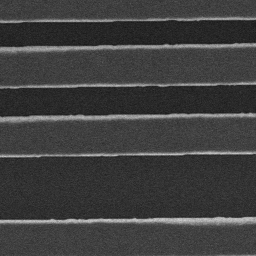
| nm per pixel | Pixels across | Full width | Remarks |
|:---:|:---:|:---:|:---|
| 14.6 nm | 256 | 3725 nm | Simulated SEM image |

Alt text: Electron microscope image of lines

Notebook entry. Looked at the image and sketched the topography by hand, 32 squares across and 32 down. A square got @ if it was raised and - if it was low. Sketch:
@@@@@@@@@@@@@@@@@@@@@@@@@@@@@@@@
@@@@@@@@@@@@@@@@@@@@@@@@@@@@@@@@
@@@@@@@@@@@@@@@@@@@@@-@@@-------
--------------------------------
--------------------------------
--------------------------------
@@@@@@@@@@@@@@@@@@@@@@@@@@@@@@@@
@@@@@@@@@@@@@@@@@@@@@@@@@@@@@@@@
@@@@@@@@@@@@@@@@@@@@@@@@@@@@@@@@
@@@@@@@@@@@@@@@@@@@@@@@@@@@@@@@@
@@@@@@@@@@@@@@@@@@@@@@@@@@@@@@@@
--------------------------------
--------------------------------
--------------------------------
------------------@@@@@@@@@@@@@@
@@@@@@@@@@@@@@@@@@@@@@@@@@@@@@@@
@@@@@@@@@@@@@@@@@@@@@@@@@@@@@@@@
@@@@@@@@@@@@@@@@@@@@@@@@@@@@@@@@
@@@@@@@@@@@@@@@@@@@@@@@@@@@@@@@@
@@@@----------------------------
--------------------------------
--------------------------------
--------------------------------
--------------------------------
--------------------------------
--------------------------------
--------------------------------
-----------@@@@-@-@@@@@@@@@@@@@@
@@@@@@@@@@@@@@@@@@@@@@@@@@@@@@@@
@@@@@@@@@@@@@@@@@@@@@@@@@@@@@@@@
@@@@@@@@@@@@@@@@@@@@@@@@@@@@@@@@
@@@@@@@@@@@@@@@@@@@@@@@@@@@@@@@@